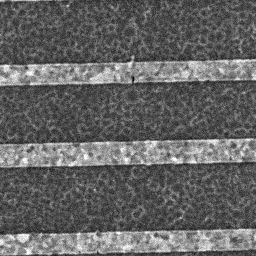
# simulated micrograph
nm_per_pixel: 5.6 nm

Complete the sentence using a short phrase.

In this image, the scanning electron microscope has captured one or a few lines or trenches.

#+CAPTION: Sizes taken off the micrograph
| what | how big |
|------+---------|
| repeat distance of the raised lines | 474 nm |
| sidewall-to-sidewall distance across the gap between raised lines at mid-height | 0.365 microns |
